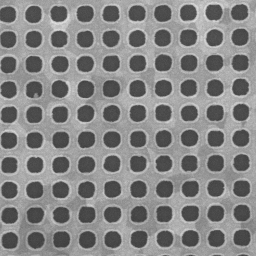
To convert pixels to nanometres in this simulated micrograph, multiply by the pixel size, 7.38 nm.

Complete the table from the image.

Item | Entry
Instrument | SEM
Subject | a regular array of holes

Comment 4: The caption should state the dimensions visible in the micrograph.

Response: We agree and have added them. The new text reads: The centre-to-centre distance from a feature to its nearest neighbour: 24.9 pixels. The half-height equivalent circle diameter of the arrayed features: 138 nm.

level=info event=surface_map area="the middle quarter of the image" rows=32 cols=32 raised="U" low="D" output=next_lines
DUUDDDDUUUDDDDUUDDDDDUUDDDDUUDDD
DUUDDDDUUUDDDUUUUDDDUUUDDDUUUDDD
UUUUUUUUUUUUUUUUUUUUUUUUUUUUUUUU
UUUUUUUUUUUUUUUUUUUUUUUUUUUUUUUU
UUUUDDDUUUDDDDUUUDDDUUUDDDDUUUDD
DUUDDDDDUUDDDDUUDDDDDUUDDDDUUDDD
DUUDDDDDUUDDDDUUDDDDDUDDDDDUUDDD
DUUDDDDUUUDDDDUUDDDDUUUDDDDUUDDD
UUUUDDDUUUUUUUUUUUDUUUUUUUUUUUUU
UUUUUUUUUUUUUUUUUUUUUUUUUUUUUUUU
UUUUDDDUUUDDDUUUUDDDUUUDDDDUUUDD
DUUDDDDDUUDDDDUUDDDDDUUDDDDUUDDD
DUUDDDDDUDDDDDUUDDDDDUDDDDDUUDDD
DUUDDDDDUUDDDDUUDDDDDUUDDDDUUDDD
UUUUDDUUUUUDDUUUUDDUUUUUDDUUUUUD
UUUUUUUUUUUUUUUUUUUUUUUUUUUUUUUU
UUUUUUUUUUUUUUUUUUDUUUUUDDUUUUUD
DUUUDDDDUUDDDDUUDDDDDUUDDDDUUDDD
DUUDDDDDUUDDDDUUDDDDDUUDDDDUUDDD
DUUDDDDDUUDDDDUUDDDDDUUDDDDUUDDD
DUUUDDDUUUDDDDUUUDDDUUUDDDUUUUDD
UUUUUUUUUUUUUUUUUUUUUUUUUUUUUUUU
UUUUUUUUUUUUUUUUUUUUUUUUUUUUUUUU
DUUUDDDDUUDDDDUUUDDDUUUDDDDUUDDD
DUUDDDDDUUDDDDDUDDDDDUUDDDDUUDDD
DUUDDDDDUUDDDDUUDDDDDUUDDDDUUDDD
DUUDDDDDUUDDDDUUUDDDUUUDDDDUUDDD
UUUUUUUUUUUUUUUUUUUUUUUUUUUUUUUU
UUUUUUUUUUUUUUUUUUUUUUUUUUUUUUUU
DUUUDDDUUUUDDDUUUDDDUUUUDDDUUUDD
DUUDDDDDUUDDDDDUDDDDDUUDDDDUUUDD
DDUDDDDDUUDDDDDUDDDDDUUDDDDUUDDD